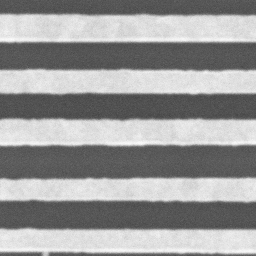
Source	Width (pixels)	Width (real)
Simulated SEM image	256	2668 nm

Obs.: lines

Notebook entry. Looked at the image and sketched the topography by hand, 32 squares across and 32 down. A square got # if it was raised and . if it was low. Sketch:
................................
................................
################################
################################
################################
................................
................................
................................
................................
################################
################################
##########..####################
................................
................................
................................
################################
################################
################################
................................
................................
................................
................................
....#......###..################
################################
################################
................................
................................
................................
................................
################################
################################
...........................#####